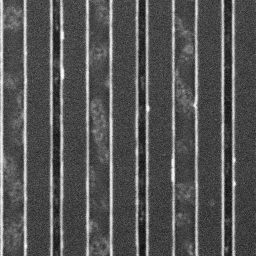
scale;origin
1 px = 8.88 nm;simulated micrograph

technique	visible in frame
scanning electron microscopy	parallel lines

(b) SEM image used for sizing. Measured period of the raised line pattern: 379 nanometers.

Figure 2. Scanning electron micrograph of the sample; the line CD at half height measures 0.24 microns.